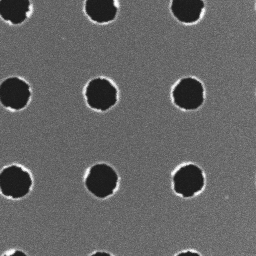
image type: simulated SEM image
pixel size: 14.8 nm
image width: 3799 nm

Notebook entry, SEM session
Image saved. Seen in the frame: holes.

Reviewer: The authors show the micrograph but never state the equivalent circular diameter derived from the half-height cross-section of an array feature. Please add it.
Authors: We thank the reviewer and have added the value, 472 nm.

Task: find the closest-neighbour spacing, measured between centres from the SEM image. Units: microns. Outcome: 1.28